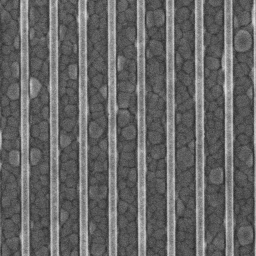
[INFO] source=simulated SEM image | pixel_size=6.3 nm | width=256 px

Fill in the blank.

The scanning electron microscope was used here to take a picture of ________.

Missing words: parallel lines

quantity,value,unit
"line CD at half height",44.9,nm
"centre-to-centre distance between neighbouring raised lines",184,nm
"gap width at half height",138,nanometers